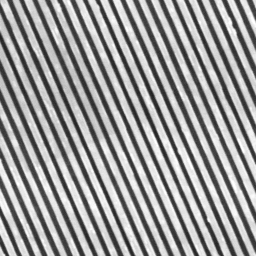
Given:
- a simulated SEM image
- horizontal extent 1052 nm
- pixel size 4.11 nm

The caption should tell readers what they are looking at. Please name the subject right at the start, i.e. parallel lines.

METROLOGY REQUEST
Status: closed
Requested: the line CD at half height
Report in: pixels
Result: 6.64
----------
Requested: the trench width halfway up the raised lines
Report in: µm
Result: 0.0198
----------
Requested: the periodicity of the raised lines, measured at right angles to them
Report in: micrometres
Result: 0.0476